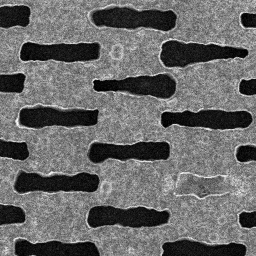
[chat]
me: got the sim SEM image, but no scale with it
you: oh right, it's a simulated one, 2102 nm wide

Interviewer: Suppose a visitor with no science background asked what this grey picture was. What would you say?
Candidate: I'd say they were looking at a regular array of holes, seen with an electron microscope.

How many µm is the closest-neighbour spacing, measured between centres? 0.537